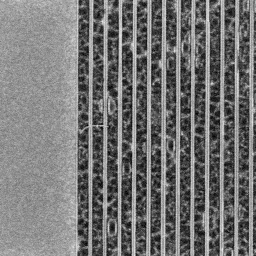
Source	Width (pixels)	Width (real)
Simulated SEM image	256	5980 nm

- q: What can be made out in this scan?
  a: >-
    parallel lines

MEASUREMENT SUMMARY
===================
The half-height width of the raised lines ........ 64.2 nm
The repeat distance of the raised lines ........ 341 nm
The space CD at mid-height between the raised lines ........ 277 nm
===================